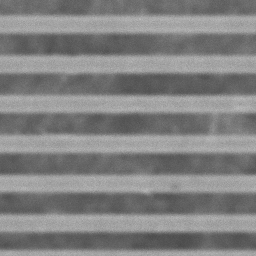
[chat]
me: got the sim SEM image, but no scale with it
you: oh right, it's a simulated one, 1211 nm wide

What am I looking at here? parallel lines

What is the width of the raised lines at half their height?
0.0798 microns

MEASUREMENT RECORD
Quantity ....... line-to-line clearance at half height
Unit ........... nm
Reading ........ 106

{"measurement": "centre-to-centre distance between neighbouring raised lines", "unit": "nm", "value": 188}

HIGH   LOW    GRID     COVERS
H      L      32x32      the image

LLLLLLLLLLLLLLLLLLLLLLLLLLLLLLLL
LLLLLLLLLLLLLLLLLLLLLLLLLLLLLLLL
HHHHHHHHHHHHHHHHHHHHHHHHHHHHHHHH
HHHHHHHHHHHHHHHHHHHHHHHHHHHHHHHH
LLLLLLLLLLLLLLLLLLLLLLLLLLLLLLLL
LLLLLLLLLLLLLLLLLLLLLLLLLLLLLLLL
LLLLLLLLLLLLLLLLLLLLLLLLLLLLLLLL
HHHHHHHHHHHHHHHHHHHHHHHHHHHHHHHH
HHHHHHHHHHHHHHHHHHHHHHHHHHHHHHHH
LLLLLLLLLLLLLLLLLLLLLLLLLLLLLLLL
LLLLLLLLLLLLLLLLLLLLLLLLLLLLLLLL
LLLLLLLLLLLLLLLLLLLLLLLLLLLLLLLL
HHHHHHHHHHHHHHHHHHHHHHHHHHHHHHHH
HHHHHHHHHHHHHHHHHHHHHHHHHHHHHHHH
LLLLLLLLLLLLLLLLLLLLLLLLLLLLLLLL
LLLLLLLLLLLLLLLLLLLLLLLLLLLLLLLL
LLLLLLLLLLLLLLLLLLLLLLLLLLLLLLLL
HHHHHHHHHHHHHHHHHHHHHHHHHHHHHHHH
HHHHHHHHHHHHHHHHHHHHHHHHHHHHHHHH
LLLLLLLLLLLLLLLLLLLLLLLLLLLLLLLL
LLLLLLLLLLLLLLLLLLLLLLLLLLLLLLLL
LLLLLLLLLLLLLLLLLLLLLLLLLLLLLLLL
HHHHHHHHHHHHHHHHHHHHHHHHHHHHHHHH
HHHHHHHHHHHHHHHHHHHHHHHHHHHHHHHH
LLLLLLLLLLLLLLLLLLLLLLLLLLLLLLLL
LLLLLLLLLLLLLLLLLLLLLLLLLLLLLLLL
LLLLLLLLLLLLLLLLLLLLLLLLLLLLLLLL
HHHHHHHHHHHHHHHHHHHHHHHHHHHHHHHH
HHHHHHHHHHHHHHHHHHHHHHHHHHHHHHHH
LLLLLLLLLLLLLLLLLLLLLLLLLLLLLLLL
LLLLLLLLLLLLLLLLLLLLLLLLLLLLLLLL
HHHHHHHHHHHHHHHHHHHHHHHHHHHHHHHH